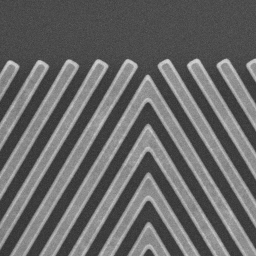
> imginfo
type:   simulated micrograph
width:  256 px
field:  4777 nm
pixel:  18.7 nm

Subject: groups of lines, slits or small figures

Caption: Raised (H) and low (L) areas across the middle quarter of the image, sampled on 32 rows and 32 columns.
HHHLLLLHHHHLLLLHHHLLLLLLHHHLLLLH
HHHLLLLHHHLLLLHHHHLLLLLLHHHHLLLL
HHLLLLHHHHLLLLHHHLLLLLLLLHHHLLLL
HHLLLLHHHLLLLHHHLLLLLLLLLHHHHLLL
HLLLLHHHHLLLHHHHLLLLHHLLLLHHHLLL
HLLLLHHHLLLLHHHLLLLHHHHLLLLHHHLL
LLLLHHHLLLLHHHHLLLLHHHHLLLLHHHHL
LLLHHHHLLLLHHHLLLLHHHHHHLLLLHHHL
LLLHHHLLLLHHHLLLLHHHHHHHLLLLLHHH
LLHHHHLLLLHHHLLLLHHHLLHHHLLLLHHH
LLHHHLLLLHHHLLLLHHHHLLHHHHLLLLHH
LHHHLLLLHHHHLLLLHHHLLLLHHHLLLLHH
HHHHLLLLHHHLLLLHHHLLLLLLHHHLLLLH
HHHLLLLHHHLLLLLHHHLLLLLLHHHHLLLL
HHHLLLLHHHLLLLHHHLLLLLLLLHHHLLLL
HHLLLLHHHLLLLHHHHLLLLLLLLHHHHLLL
HLLLLHHHHLLLLHHHLLLLHHLLLLHHHLLL
HLLLLHHHLLLLHHHLLLLHHHHLLLLHHHLL
LLLLHHHHLLLLHHHLLLLHHHHLLLLHHHHL
LLLLHHHLLLLHHHLLLLHHHHHHLLLLHHHL
LLLHHHLLLLHHHHLLLLHHHHHHLLLLHHHH
LLHHHHLLLLHHHLLLLHHHHHHHHLLLLHHH
LLHHHLLLLHHHLLLLLHHHLLHHHHLLLLHH
LHHHHLLLLHHHLLLLHHHLLLLHHHLLLLHH
LHHHLLLLHHHLLLLHHHHLLLLHHHHLLLLH
HHHLLLLHHHHLLLLHHHLLLLLLHHHLLLLL
HHHLLLLHHHLLLLHHHHLLLLLLLHHHLLLL
HHLLLLHHHHLLLLHHHLLLLLLLLHHHHLLL
HHLLLLHHHLLLLHHHLLLLHHLLLLHHHLLL
HLLLLHHHLLLLHHHHLLLLHHHLLLLHHHLL
LLLLHHHHLLLLHHHLLLLHHHHLLLLHHHLL
LLLLHHHLLLLHHHHLLLLHHHHHLLLLHHHL